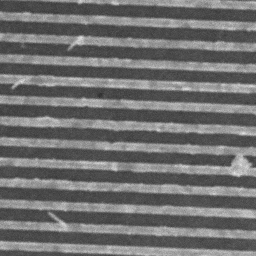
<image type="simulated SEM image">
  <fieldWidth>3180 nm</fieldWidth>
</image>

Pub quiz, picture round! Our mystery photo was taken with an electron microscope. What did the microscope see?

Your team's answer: parallel lines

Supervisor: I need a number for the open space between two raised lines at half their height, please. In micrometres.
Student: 0.166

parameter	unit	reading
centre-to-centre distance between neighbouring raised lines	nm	259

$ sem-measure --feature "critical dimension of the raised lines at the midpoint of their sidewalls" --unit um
0.0946